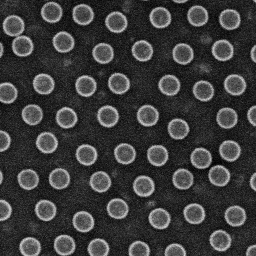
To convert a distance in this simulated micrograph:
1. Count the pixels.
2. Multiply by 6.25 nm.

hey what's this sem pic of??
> a regular array of raised bodies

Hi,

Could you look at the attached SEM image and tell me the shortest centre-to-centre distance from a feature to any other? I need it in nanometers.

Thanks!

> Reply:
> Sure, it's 200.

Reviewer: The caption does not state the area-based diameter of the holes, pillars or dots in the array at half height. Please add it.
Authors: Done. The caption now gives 123 nm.